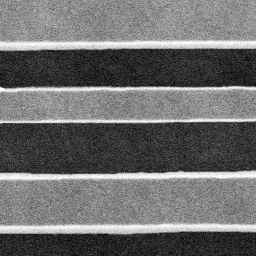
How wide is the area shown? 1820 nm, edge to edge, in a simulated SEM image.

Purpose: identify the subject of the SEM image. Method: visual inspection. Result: lines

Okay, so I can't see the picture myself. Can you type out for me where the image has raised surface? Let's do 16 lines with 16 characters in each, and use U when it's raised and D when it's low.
UUUUUUUUUUUUUUUU
UUUUUUUUUUUUUUUU
UUUUUUUUUUUUUUUU
DDDDDDDDDDDDDDDD
DDDDDDDDDDDDDDDD
DDDDDDDDDDDDDDUU
UUUUUUUUUUUUUUUU
UUUUUUUUUUUUUUUU
DDDDDDDDDDDDDDDD
DDDDDDDDDDDDDDDD
DDDDDDDDDDDDDDDD
UUUUUUUUUUUUUUUU
UUUUUUUUUUUUUUUU
UUUUUUUUUUUUUUUU
DDDDDDDDDDDDDDDD
DDDDDDDDDDDDDDDD